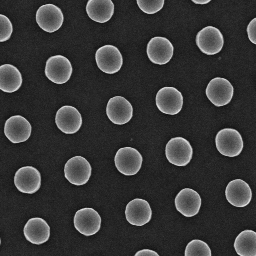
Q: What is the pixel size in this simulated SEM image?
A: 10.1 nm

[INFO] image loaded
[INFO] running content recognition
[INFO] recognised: a regular array of raised bodies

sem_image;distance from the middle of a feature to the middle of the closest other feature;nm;514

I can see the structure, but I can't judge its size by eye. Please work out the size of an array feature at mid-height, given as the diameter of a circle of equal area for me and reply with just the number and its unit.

274 nm